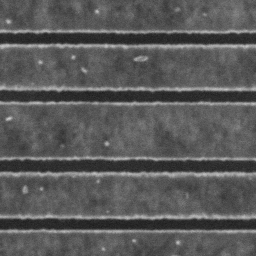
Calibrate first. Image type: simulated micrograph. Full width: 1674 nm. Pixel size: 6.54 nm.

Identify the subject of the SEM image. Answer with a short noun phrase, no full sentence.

lines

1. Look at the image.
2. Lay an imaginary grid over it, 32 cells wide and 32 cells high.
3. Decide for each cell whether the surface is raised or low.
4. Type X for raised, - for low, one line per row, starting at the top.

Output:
XXXXXXXXXXXXXXXXXXXXXXXXXXXXXXXX
XXXXXXXXXXXXXXXXXXXXXXXXXXXXXXXX
XXXXXXXXXXXXXXXXXXXXXXXXXXXXXXXX
XXXXXXXXXXXXXXXXXXXXXXXXXXXXXXXX
--------------------------------
--------------------------------
XXXXXXXXXXXXXXXXXXXXXXXXXXXXXXXX
XXXXXXXXXXXXXXXXXXXXXXXXXXXXXXXX
XXXXXXXXXXXXXXXXXXXXXXXXXXXXXXXX
XXXXXXXXXXXXXXXXXXXXXXXXXXXXXXXX
XXXXXXXXXXXXXXXXXXXXXXXXXXXXXXXX
--------------------------------
--------------------------------
XXXXXXXXXXXXXXXXXXXXXXXXXXXXXXXX
XXXXXXXXXXXXXXXXXXXXXXXXXXXXXXXX
XXXXXXXXXXXXXXXXXXXXXXXXXXXXXXXX
XXXXXXXXXXXXXXXXXXXXXXXXXXXXXXXX
XXXXXXXXXXXXXXXXXXXXXXXXXXXXXXXX
XXXXXXXXXXXXXXXXXXXXXXXXXXXXXXXX
XXXXXXXXXXXXXXXXXXXXXXXXXXXXXXXX
--------------------------------
--------------------------------
XXXXXXXXXXXXXXXXXXXXXXXXXXXXXXXX
XXXXXXXXXXXXXXXXXXXXXXXXXXXXXXXX
XXXXXXXXXXXXXXXXXXXXXXXXXXXXXXXX
XXXXXXXXXXXXXXXXXXXXXXXXXXXXXXXX
XXXXXXXXXXXXXXXXXXXXXXXXXXXXXXXX
--------------------------------
--------------------------------
XXXXXXXXXXXXXXXXXXXXXXXXXXXXXXXX
XXXXXXXXXXXXXXXXXXXXXXXXXXXXXXXX
XXXXXXXXXXXXXXXXXXXXXXXXXXXXXXXX